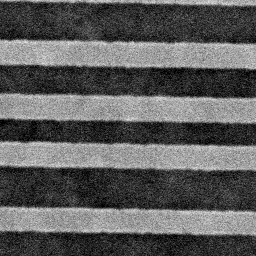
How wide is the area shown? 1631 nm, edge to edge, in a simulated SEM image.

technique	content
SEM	lines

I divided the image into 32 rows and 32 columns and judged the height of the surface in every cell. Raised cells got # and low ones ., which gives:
...........................#####
................................
................................
................................
................................
####################..#.........
################################
################################
..............................##
................................
................................
................................
################################
################################
################################
................................
................................
................................
################################
################################
################################
................................
................................
................................
................................
................................
##########################......
################################
################################
................................
................................
................................